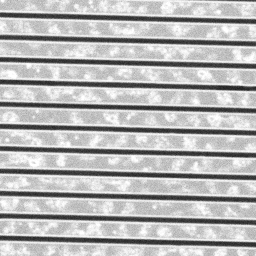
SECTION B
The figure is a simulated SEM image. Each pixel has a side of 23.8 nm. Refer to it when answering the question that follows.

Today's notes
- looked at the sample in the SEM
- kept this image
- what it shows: parallel lines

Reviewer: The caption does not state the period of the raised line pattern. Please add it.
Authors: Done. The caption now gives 532 nanometers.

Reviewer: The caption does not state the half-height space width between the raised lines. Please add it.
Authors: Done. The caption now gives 149 nanometres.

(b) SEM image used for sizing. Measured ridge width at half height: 0.387 microns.